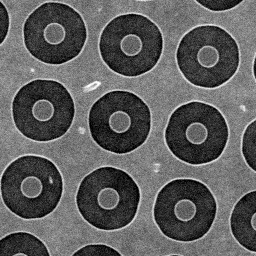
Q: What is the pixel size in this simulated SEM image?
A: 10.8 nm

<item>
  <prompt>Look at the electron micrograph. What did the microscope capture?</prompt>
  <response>an array of small figures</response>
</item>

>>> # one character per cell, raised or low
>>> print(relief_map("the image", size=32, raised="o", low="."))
ooooo...ooooooooooooooooo.....oo
.ooo......oooooooooooooooooooooo
.oo.......oooo.....ooooooooooooo
.oo...oo...oo.......oooo....oooo
.oo...oo...oo...o...ooo......ooo
ooo........o...ooo..oo........oo
oooo......oo....o...oo...oo...oo
ooooo....oooo.......oo...oo...oo
oooooooooooooo.....ooo........oo
ooooooooooooooo..oooooo......ooo
ooo.....oooooooooooooooo....oooo
oo.......ooooo..oooooooooooooooo
oo.......ooo......oooooooooooooo
o...ooo..oo........ooo.....ooooo
oo..oo...oo...oo...oo.......oooo
oo.......oo...oo...oo...o...ooo.
ooo.....ooo........oo..ooo...oo.
oooo...ooooo......ooo...oo..oo..
ooooooooooooo....oooo.......oo..
ooo..ooooooooooooooooo.....ooo..
o......ooooooooooooooooo.oooooo.
.......oooo.....oooooooooooooooo
...oo...oo.......ooooo..oooooooo
...oo...oo.......ooo......oooooo
...oo...oo..ooo...oo.......ooo..
o......ooo..ooo..oo...oo...ooo..
oo....oooo.......oo...oo...oo...
ooooooooooo......oo....o...oo..o
oooooooooooo...ooooo......ooo...
o...ooooooooooooooooo....oooo...
.....ooooooooooooooooooooooooo..
......ooo......ooooooooooooooooo